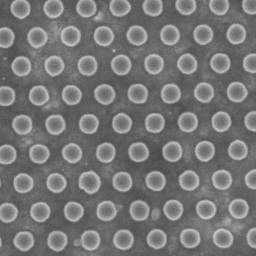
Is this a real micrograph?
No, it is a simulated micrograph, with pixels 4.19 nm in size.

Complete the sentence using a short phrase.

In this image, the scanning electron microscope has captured a regular array of raised bodies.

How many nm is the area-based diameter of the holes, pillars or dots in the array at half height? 78.2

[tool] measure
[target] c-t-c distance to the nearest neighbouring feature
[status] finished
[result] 138 nm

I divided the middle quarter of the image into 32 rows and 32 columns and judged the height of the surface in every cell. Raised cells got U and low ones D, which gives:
DDDDUUUUDDDDUUUUUDDDUUUUUDDDDUUU
DDDDUUUUDDDDUUUUDDDDDUUUDDDDDUUU
DDDDDUUDDDDDDDUDDDDDDDDDDDDDDDDD
DDDDDDDDDDDDDDDDDDDDDDDDDDDDDDDD
DDDDDDDDDDDDDDDDDDDDDDDDDDDDDDDD
DDDDDDDDDUUDDDDDDUUUDDDDDUUUDDDD
UUUUDDDDUUUUDDDDUUUUUDDDDUUUUDDD
UUUUDDDDUUUUDDDDUUUUUDDDUUUUUDDD
UUUUDDDDUUUUDDDDUUUUDDDDDUUUUDDD
UUUDDDDDDUUUDDDDDDDDDDDDDDUUDDDD
DDDDDDDDDDDDDDDDDDDDDDDDDDDDDDDD
DDDDDDDDDDDDDDDDDDDDDDDDDDDDDDDD
DDDDDDDDDDDDDDUDDDDDDDDDDDDDDDUU
DDDDDUUUDDDDDUUUDDDDDUUUUDDDDUUU
DDDDUUUUDDDDUUUUUDDDDUUUUDDDDUUU
DDDDUUUUDDDDUUUUUDDDDUUUUDDDDUUU
DDDDUUUUDDDDDUUUDDDDDUUUDDDDDDUU
DDDDDDDDDDDDDDDDDDDDDDDDDDDDDDDD
DDDDDDDDDDDDDDDDDDDDDDDDDDDDDDDD
DDDDDDDDDDDDDDDDDDDDDDDDDDDDDDDD
DUUDDDDDDUUUDDDDDUUUDDDDDUUUUDDD
UUUUDDDDUUUUDDDDUUUUUDDDDUUUUDDD
UUUUDDDDUUUUDDDDUUUUUDDDDUUUUDDD
UUUUDDDDDUUUDDDDDUUUDDDDDUUUUDDD
DDUDDDDDDDDDDDDDDDDDDDDDDDDDDDDD
DDDDDDDDDDDDDDDDDDDDDDDDDDDDDDDD
DDDDDDDDDDDDDDDDDDDDDDDDDDDDDDDD
DDDDDUUUDDDDDUUUDDDDDUUUDDDDDDUU
DDDDUUUUUDDDUUUUUDDDDUUUUDDDDUUU
DDDDUUUUUDDDUUUUUDDDDUUUUDDDDUUU
DDDDUUUUUDDDDUUUUDDDDUUUUDDDDUUU
DDDDDUUUDDDDDDUUDDDDDDUUDDDDDDDD